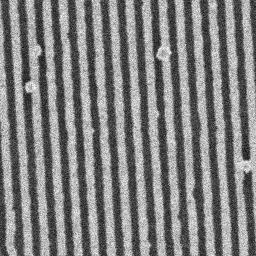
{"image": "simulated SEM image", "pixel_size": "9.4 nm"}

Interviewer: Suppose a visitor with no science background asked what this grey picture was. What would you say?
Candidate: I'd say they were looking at parallel lines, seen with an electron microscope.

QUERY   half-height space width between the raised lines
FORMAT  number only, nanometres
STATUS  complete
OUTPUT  72.7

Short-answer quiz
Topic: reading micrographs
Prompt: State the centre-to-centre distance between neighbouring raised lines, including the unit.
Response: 0.155 µm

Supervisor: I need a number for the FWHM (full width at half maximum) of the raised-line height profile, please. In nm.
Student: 80.9